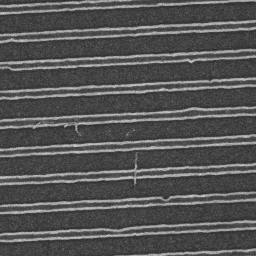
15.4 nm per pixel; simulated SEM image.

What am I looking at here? parallel lines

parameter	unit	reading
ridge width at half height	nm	118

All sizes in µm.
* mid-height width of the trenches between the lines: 0.327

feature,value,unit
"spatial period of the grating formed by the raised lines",440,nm